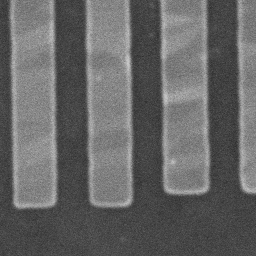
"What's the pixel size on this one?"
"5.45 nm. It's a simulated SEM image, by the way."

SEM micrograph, wiring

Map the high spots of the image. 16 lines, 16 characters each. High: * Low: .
.**..***..***..*
.**..***..***..*
.**..***..***..*
.**..***..***..*
.**..***..***..*
.**...**..***..*
.**...**..***..*
.**...**..***..*
.**...**..***..*
.**...**..***..*
.**...**..***..*
.**...**..***..*
.**...**........
................
................
................